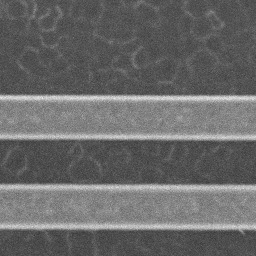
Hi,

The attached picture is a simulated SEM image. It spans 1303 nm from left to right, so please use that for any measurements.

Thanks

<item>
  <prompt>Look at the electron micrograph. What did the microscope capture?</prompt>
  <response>one or a few lines or trenches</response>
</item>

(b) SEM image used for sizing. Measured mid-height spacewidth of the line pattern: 244 nanometres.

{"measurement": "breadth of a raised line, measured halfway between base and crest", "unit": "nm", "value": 208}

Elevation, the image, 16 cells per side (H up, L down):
LLLLLLLLLLLLLLLL
LLLLLLLLLLLLLLLL
LLLLLLLLLLLLLLLL
LLLLLLLLLLLLLLLL
LLLLLLLLLLLLLLLL
LLLLLLLLLLLLLLLL
HHHHHHHHHHHHHHHH
HHHHHHHHHHHHHHHH
HHHHHHHHHHHHHHHH
LLLLLLLLLLLLLLLL
LLLLLLLLLLLLLLLL
LLLLLLLLLLLLLLLL
HHHHHHHHHHHHHHHH
HHHHHHHHHHHHHHHH
LLLLLLLLLLLLLLLL
LLLLLLLLLLLLLLLL